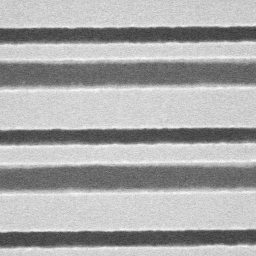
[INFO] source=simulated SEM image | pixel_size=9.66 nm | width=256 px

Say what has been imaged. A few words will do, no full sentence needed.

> lines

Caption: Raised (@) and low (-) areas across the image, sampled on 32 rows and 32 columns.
@@@@@@@@@@@@@@@@@@@@@@@@@@@@@@@@
@@@@@@@@@@@@@@@@@@@@@@@@@@@@@@@@
@@@@@@@@@@@@@@@@@@@@@@@@@@@@@@@@
--------------------------------
--------------------------------
--------------@@---@@@@@@@@@@@@@
@@@@@@@@@@@@@@@@@@@@@@@@@@@@@@@@
@@---@--------------------------
--------------------------------
--------------------------------
--------------------------------
@@@@@@@@@@@@@@@@@@@@@@@@@@@@@@@@
@@@@@@@@@@@@@@@@@@@@@@@@@@@@@@@@
@@@@@@@@@@@@@@@@@@@@@@@@@@@@@@@@
@@@@@@@@@@@@@@@@@@@@@@@@@@@@@@@@
@@@@@@@@@@@@@@@@@@@@@@@@@@@@@@@@
--------------------------------
--------------------------------
@@@@@@@@@@@@@@@@@@@@@@@@@@@@@@@@
@@@@@@@@@@@@@@@@@@@@@@@@@@@@@@@@
@@@@@---------------------------
--------------------------------
--------------------------------
--------------------------------
@@@@@@@@@@@@@@@@@@@@@@@@@@@@@@@@
@@@@@@@@@@@@@@@@@@@@@@@@@@@@@@@@
@@@@@@@@@@@@@@@@@@@@@@@@@@@@@@@@
@@@@@@@@@@@@@@@@@@@@@@@@@@@@@@@@
@@@@@@@@@@@@@@@@@@@@@@@@@@@@@@@@
--------------------------------
--------------------------------
@@@@@@@@@@@@@@@@@@@@@@@@@@@@@@@@